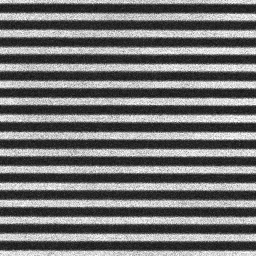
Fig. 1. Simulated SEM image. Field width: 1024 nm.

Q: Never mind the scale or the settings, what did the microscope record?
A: parallel lines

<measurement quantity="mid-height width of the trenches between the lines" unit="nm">32.5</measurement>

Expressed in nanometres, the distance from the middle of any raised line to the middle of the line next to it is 67.9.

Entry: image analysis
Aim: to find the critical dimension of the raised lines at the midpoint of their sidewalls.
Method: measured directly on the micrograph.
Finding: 0.036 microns